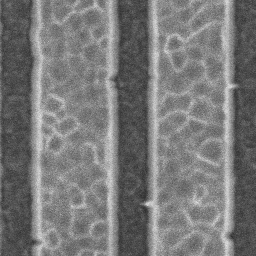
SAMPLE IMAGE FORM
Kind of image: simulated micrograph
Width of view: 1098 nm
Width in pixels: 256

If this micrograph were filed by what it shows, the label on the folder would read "one or a few lines or trenches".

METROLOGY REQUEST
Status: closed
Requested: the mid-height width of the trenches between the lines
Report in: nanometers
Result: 168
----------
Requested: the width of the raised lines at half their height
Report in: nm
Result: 332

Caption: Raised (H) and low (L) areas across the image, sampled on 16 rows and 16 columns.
LLHHHHHLLLHHHHLL
LLHHHHHLLLHHHHLL
LLHHHHHLLLHHHHLL
LLHHHHHLLLHHHHLL
LLHHHHHLLLHHHHLL
LLHHHHHLLLHHHHLL
LLHHHHHLLLHHHHLL
LLHHHHHLLLHHHHLL
LLHHHHHLLLHHHHLL
LLHHHHHLLLHHHHLL
LLHHHHHLLLHHHHLL
LLHHHHHLLLHHHHLL
LLHHHHHLLHHHHHLL
LLHHHHHLLLHHHHLL
LLHHHHHLLLHHHHLL
LLHHHHHLLLHHHHLL